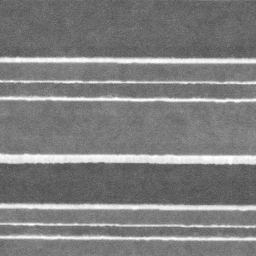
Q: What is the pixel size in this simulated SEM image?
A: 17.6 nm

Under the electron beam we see lines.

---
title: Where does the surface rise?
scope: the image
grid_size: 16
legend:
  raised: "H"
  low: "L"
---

LLLLLLLLLLLLLLLL
LLLLLLLLLLLLLLLL
LLLLLLLLLLLLLLLL
LLLLLLLLLLLLLLLL
HHHHHHHHHHHHHHHH
HHHHHHHHHHHHHHHH
HHHHHHHHHHHHHHHH
HHHHHHHHHHHHHHHH
HHHHHHHHHHHHHHHH
HHHHHHHHHHHHHHHH
LLLLLLLLLLLLLLLL
LLLLLLLLLLLLLLLL
LLLLLLLLLLLLLLLL
HHHHHHHHHHHHHHHH
HHHHHHHHHHHHHHHH
HHHHHHHHHHHHHHHH